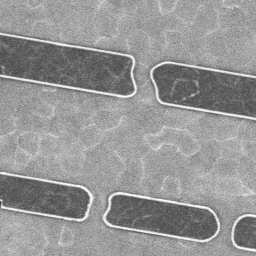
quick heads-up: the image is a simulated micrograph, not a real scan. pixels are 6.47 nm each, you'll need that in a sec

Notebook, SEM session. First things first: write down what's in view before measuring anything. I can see one or a few lines or trenches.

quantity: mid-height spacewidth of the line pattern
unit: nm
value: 624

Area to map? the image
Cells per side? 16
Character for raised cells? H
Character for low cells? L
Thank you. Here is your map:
LLLLLLLLLLLLLLLL
LLLLLLLLLLLLLLLL
HHLLLLLLLLLLLLLL
HHHHHHHHLLLLLLLL
HHHHHHHHLLHHHHLL
LLLLHHHHLLHHHHHH
LLLLLLLLLLHHHHHH
LLLLLLLLLLLLLLLL
LLLLLLLLLLLLLLLL
LLLLLLLLLLLLLLLL
LLLLLLLLLLLLLLLL
HHHHLLLLLLLLLLLL
HHHHHHLHHHLLLLLL
LLLHHLLHHHHHHLLH
LLLLLLLLLHHHHHLH
LLLLLLLLLLLLLLLH